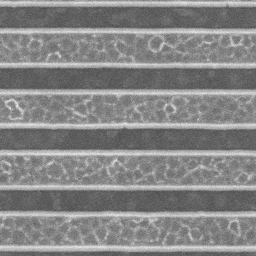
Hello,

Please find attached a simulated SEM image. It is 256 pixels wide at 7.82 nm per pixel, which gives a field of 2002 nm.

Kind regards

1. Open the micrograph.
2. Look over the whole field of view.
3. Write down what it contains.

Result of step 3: one or a few lines or trenches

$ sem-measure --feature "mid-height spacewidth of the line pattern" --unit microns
0.204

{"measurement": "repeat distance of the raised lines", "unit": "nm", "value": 478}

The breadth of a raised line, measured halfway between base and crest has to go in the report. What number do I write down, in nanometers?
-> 275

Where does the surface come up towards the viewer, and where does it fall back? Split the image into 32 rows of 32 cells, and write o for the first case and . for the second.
........ooooo...oooooo.ooooooooo
................................
................................
................................
oooooooooooooooooooooooooooooooo
oooooooooooooooooooooooooooooooo
oooooooooooooooooooooooooooooooo
oooooooooooooooooooooooooooooooo
................................
................................
................................
................................
oooooooooooooooooooooooooooooooo
oooooooooooooooooooooooooooooooo
oooooooooooooooooooooooooooooooo
oooooooooooooooooooooooooooooooo
................................
................................
................................
oooooooooooooooooooooooooooooooo
oooooooooooooooooooooooooooooooo
oooooooooooooooooooooooooooooooo
oooooooooooooooooooooooooooooooo
...................oooo..ooo...o
................................
................................
................................
oooooooooooooooooooooooooooooooo
oooooooooooooooooooooooooooooooo
oooooooooooooooooooooooooooooooo
oooooooooooooooooooooooooooooooo
................................